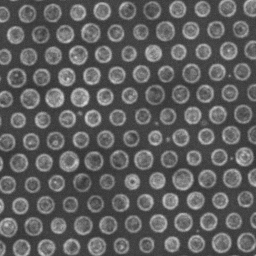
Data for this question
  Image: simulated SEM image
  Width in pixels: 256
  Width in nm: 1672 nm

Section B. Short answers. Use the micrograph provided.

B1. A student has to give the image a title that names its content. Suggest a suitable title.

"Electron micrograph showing a regular array of raised bodies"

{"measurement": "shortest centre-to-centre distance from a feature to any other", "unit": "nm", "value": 159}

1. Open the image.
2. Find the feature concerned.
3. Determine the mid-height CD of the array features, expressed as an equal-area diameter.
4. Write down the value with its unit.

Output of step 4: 0.103 micrometres